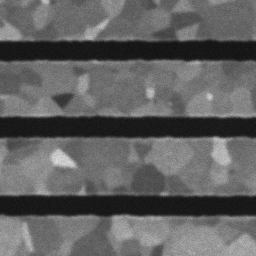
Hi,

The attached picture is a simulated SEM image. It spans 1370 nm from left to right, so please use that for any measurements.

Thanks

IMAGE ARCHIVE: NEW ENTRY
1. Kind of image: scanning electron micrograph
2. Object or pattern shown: lines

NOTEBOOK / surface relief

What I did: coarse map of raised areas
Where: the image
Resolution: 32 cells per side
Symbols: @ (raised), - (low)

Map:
@@@@@@@@@@@@@@@@@@@@@@@@@@@@@@@@
@@@@@@@@@@@@@@@@@@@@@@@@@@@@@@@@
@@@@@@@@@@@@@@@@@@@@@@@@@@@@@@@@
@@@@@@@@@@@@@@@@@@@@@@@@@@@@@@@@
@@@@@@@@@@@@@@@@@@@@@@@@@@@@@@@@
--------------------------------
--------------------------------
--------------------------------
@@@@@@@@@@@@@@@@@@@@@@@@@@@@@@@@
@@@@@@@@@@@@@@@@@@@@@@@@@@@@@@@@
@@@@@@@@@@@@@@@@@@@@@@@@@@@@@@@@
@@@@@@@@@@@@@@@@@@@@@@@@@@@@@@@@
@@@@@@@@@@@@@@@@@@@@@@@@@@@@@@@@
@@@@@@@@@@@@@@@@@@@@@@@@@@@@@@@@
@@@@@@@-@@-@-@@@@@--@@@@@@@@@@@@
--------------------------------
--------------------------------
@@@@@@@@@@@@@@@@@@@@@@@@@@@@@@@@
@@@@@@@@@@@@@@@@@@@@@@@@@@@@@@@@
@@@@@@@@@@@@@@@@@@@@@@@@@@@@@@@@
@@@@@@@@@@@@@@@@@@@@@@@@@@@@@@@@
@@@@@@@@@@@@@@@@@@@@@@@@@@@@@@@@
@@@@@@@@@@@@@@@@@@@@@@@@@@@@@@@@
@@@@@@@@@@@@@@@@@@@@@@@@@@@@@@@@
--------------------------------
--------------------------------
--------------------------------
@@@@@@@@@@@@@@@@@@@@@@@@@@@@@@@@
@@@@@@@@@@@@@@@@@@@@@@@@@@@@@@@@
@@@@@@@@@@@@@@@@@@@@@@@@@@@@@@@@
@@@@@@@@@@@@@@@@@@@@@@@@@@@@@@@@
@@@@@@@@@@@@@@@@@@@@@@@@@@@@@@@@